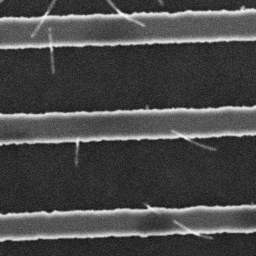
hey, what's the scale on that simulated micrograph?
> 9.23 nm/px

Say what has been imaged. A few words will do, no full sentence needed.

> lines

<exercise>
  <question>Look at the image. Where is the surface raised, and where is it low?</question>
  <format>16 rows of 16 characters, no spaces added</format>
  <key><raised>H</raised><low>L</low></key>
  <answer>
LLLLLLLLLLLLLLLL
HHHHHHHHHHHHHHHH
HHHHHHHHHHHHHHHH
LLLLLLLLLLLLLLLL
LLLLLLLLLLLLLLLL
LLLLLLLLLLLLLLLL
LLLLLLLLLLLLLLLL
HHHHHHHHHHHHHHHH
HHHHHHHHHHHHHHLL
LLLLLLLLLLLLLLLL
LLLLLLLLLLLLLLLL
LLLLLLLLLLLLLLLL
LLLLLLLLLLLLLLLL
HHHHHHHHHHHHHHHH
HHHHHHHHHHHHHHHH
LLLLLLLLLLLLLLLL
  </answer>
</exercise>